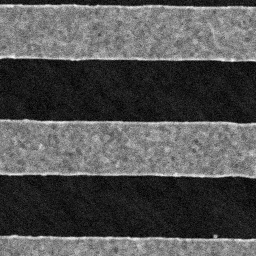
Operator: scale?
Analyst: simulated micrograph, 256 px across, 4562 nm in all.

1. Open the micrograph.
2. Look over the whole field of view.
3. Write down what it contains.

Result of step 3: wiring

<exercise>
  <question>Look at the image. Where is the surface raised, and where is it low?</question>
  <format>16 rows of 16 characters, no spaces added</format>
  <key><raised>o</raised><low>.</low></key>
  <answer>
oooooooooooooooo
oooooooooooooooo
oooooooooooooooo
oooooooooooooooo
................
................
................
................
oooooooooooooooo
oooooooooooooooo
oooooooooooooooo
................
................
................
................
oooooooooooooooo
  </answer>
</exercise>